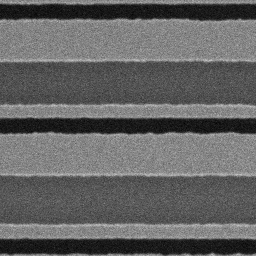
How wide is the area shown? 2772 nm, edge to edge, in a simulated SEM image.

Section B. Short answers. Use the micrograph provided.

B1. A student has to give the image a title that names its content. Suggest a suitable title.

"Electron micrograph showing lines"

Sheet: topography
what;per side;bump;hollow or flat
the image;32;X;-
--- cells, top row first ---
--------------------------------
--------------------------------
X-XXXXX--XXX--XX-X-XXXXX--------
XXXXXXXXXXXXXXXXXXXXXXXXXXXXXXXX
XXXXXXXXXXXXXXXXXXXXXXXXXXXXXXXX
XXXXXXXXXXXXXXXXXXXXXXXXXXXXXXXX
XXXXXXXXXXXXXXXXXXXXXXXXXXXXXXXX
XXXXXXXXXXXXXXXXXXXXXXXXXXXXXXXX
--------------------------------
--------------------------------
--------------------------------
--------------------------------
--------------------------------
XXXXXXXXXXXXXXXXXXXXXXXXXXXXXXXX
XXXXXXXXXXXXXXXXXXXXXXXXXXXXXXXX
--------------------------------
--------------------------------
XXXXXXXXXXXXXXXXXXXXXXXXXXXXXXXX
XXXXXXXXXXXXXXXXXXXXXXXXXXXXXXXX
XXXXXXXXXXXXXXXXXXXXXXXXXXXXXXXX
XXXXXXXXXXXXXXXXXXXXXXXXXXXXXXXX
XXXXXXXXXXXXXXXXXXXXXXXXXXXXXXXX
--------------------------------
--------------------------------
--------------------------------
--------------------------------
--------------------------------
--------------------------------
XXXXXXXXXXXXXXXXXXXXXXXXXXXXXXXX
XXXXXXXXXXXXXXXXXXXXXXXXXXXXXXXX
--------------------------------
--------------------------------